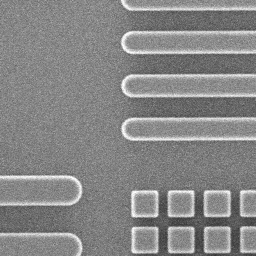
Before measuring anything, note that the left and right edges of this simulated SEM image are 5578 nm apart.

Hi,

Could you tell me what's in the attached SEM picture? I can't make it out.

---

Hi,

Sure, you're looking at groups of lines, slits or small figures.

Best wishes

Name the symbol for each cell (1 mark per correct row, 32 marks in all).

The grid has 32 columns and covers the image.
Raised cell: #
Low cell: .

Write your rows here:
...............#################
................................
................................
................................
................################
...............#################
................################
................................
................................
................################
...............#################
................################
................................
................................
................................
...............#################
...............#################
................................
................................
................................
................................
................................
##########......................
##########......................
##########.......###.###..###.##
#########........###.###..###.##
.................###.###..###.##
................................
.................##..###..###.##
#########........###.###..###.##
##########.......###.###..###.##
##########.......##..###..##..##